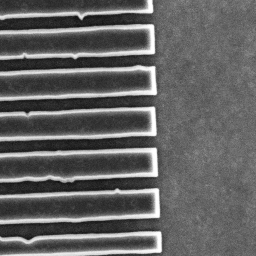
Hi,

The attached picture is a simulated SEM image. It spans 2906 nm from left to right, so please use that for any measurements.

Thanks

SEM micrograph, parallel lines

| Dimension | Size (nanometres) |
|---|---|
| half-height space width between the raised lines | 164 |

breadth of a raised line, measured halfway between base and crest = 296 nanometres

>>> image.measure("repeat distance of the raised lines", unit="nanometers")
462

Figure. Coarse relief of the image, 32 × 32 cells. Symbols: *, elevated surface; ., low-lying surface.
*******************.............
*****************...............
................................
............*******.............
*******************.............
*******************.............
*******************.............
................................
.................*..............
*******************.............
*******************.............
*******************.............
................................
................................
*******************.............
*******************.............
*******************.............
................................
................................
*******************.............
*******************.............
*******************.............
**......*.......................
................................
.*******************............
********************............
********************............
**********......................
................................
...........*********............
********************............
**************.**...............